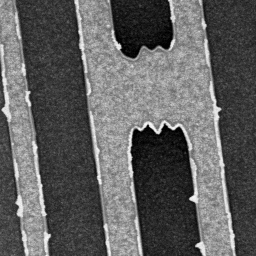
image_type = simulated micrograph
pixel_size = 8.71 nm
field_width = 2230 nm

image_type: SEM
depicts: one or a few lines or trenches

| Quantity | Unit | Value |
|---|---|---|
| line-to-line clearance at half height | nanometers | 499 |